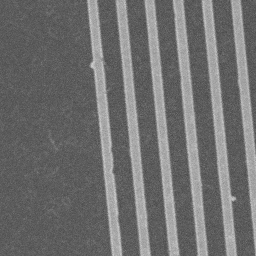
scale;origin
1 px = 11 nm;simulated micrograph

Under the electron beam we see parallel lines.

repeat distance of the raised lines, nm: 314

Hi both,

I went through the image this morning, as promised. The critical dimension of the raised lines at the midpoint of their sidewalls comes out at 95.7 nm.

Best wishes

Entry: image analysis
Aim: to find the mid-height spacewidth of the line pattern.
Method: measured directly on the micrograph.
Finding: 211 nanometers